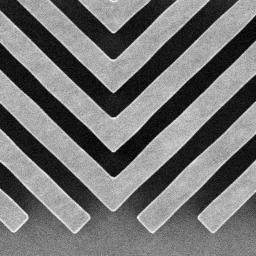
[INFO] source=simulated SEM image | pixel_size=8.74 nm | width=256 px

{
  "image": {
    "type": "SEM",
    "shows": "groups of lines, slits or small figures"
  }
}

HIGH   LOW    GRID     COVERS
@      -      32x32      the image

---@@@@---@@@@@@@@----@@@@---@@@
----@@@@---@@@@@@---@@@@@---@@@@
@----@@@@---@@@@---@@@@@---@@@@-
@@----@@@@---@@---@@@@@---@@@@--
@@@----@@@@------@@@@@---@@@@---
@@@@----@@@@----@@@@----@@@@----
-@@@@----@@@@--@@@@@---@@@@----@
--@@@@----@@@@@@@@@---@@@@----@@
---@@@@----@@@@@@@---@@@@----@@@
@---@@@@----@@@@----@@@@---@@@@@
@@---@@@@----@@----@@@@---@@@@@-
@@@---@@@@@-------@@@@---@@@@@--
@@@@---@@@@@-----@@@@---@@@@@---
-@@@@---@@@@@---@@@@---@@@@@---@
--@@@@---@@@@@-@@@@---@@@@@---@@
---@@@@----@@@@@@@---@@@@----@@@
----@@@@----@@@@@---@@@@@---@@@@
@----@@@@----@@@---@@@@@---@@@@-
@@----@@@@----@---@@@@@---@@@@--
@@@----@@@@------@@@@@---@@@@---
@@@@----@@@@----@@@@----@@@@---@
-@@@@@---@@@@--@@@@----@@@@----@
--@@@@@---@@@@@@@@----@@@@---@@@
---@@@@@---@@@@@@----@@@@---@@@@
@---@@@@@---@@@@----@@@@---@@@@-
@@---@@@@@---@@----@@@@---@@@@--
@@@---@@@@@-------@@@@---@@@@---
@@@-----@@@------@@@@----@@@----
-@-------@--------@@------@-----
--------------------------------
--------------------------------
--------------------------------